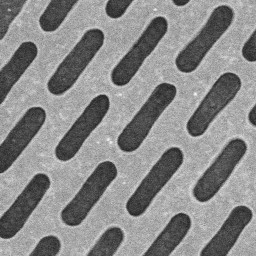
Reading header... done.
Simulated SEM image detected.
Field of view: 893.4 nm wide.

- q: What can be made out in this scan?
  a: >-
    a regular array of holes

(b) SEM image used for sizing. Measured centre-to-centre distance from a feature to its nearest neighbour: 0.224 µm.